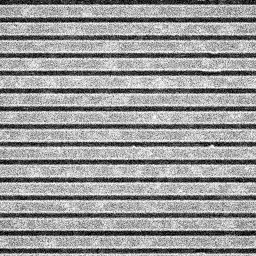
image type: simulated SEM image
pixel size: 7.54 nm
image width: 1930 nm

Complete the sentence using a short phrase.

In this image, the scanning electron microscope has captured parallel lines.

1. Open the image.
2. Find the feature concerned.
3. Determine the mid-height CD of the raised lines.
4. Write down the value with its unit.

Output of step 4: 93.3 nanometres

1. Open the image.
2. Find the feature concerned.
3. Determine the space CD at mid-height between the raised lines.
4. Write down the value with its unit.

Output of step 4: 0.0396 um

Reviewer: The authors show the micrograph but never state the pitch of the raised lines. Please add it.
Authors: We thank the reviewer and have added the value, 134 nanometers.